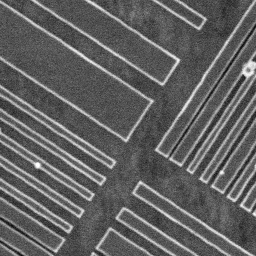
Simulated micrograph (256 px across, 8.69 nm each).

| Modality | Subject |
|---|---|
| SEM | groups of lines, slits or small figures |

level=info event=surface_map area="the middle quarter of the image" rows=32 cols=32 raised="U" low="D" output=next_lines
UUUUUUUUUDDDDDDDDUUUUUUUUUUUDDDD
UUUUUUUUUUDDDDDDDDDUUUUUUUUDDDDD
UUUUUUUUUUUUDDDDDDDDUUUUUUUDDDDD
UUUUUUUUUUUUUDDDDDDDDDUUUUDDDDDD
UUUUUUUUUUUUUUUDDDDDDDDUUDDDDDDD
UUUUUUUUUUUUUUUUDDDDDDDDDDDDDDDD
UUUUUUUUUUUUUUUUUUDDDDDDDDDDDDDD
UUUUUUUUUUUUUUUUUUUDDDDDDDDDDDDD
UUUUUUUUUUUUUUUUUUUUUDDDDDDDDDDD
DUUUUUUUUUUUUUUUUUUUUUDDDDDDDDDU
DDUUUUUUUUUUUUUUUUUUUDDDDDDDDDUU
DDDDUUUUUUUUUUUUUUUUUDDDDDDDDDUU
DDDDDUUUUUUUUUUUUUUUDDDDDDDDDUUU
DDDDDDDUUUUUUUUUUUUDDDDDDDDDUUUU
DDDDDDDDUUUUUUUUUUUDDDDDDDDDUUUU
DDDDDDDDDDUUUUUUUUDDDDDDDDDUUUUD
UDDDDDDDDDDUUUUUUDDDDDDDDDUUUUDU
UUDDDDDDDDDDDUUUUDDDDDDDDUUUUUDU
UUUUDDDDDDDDDDUUDDDDDDDDDUUUUDUU
DDUUUDDDDDDDDDDDDDDDDDDDUUUUDUUU
DDDUUUUDDDDDDDDDDDDDDDDDUUUUUUUU
DDDDDUUUDDDDDDDDDDDDDDDUUUUDUUUU
UDDDDDUUUUDDDDDDDDDDDDDDUUDUUUUD
UUDDDDDDUUUDDDDDDDDDDDDDDDDUUUUD
DUUUDDDDDUUUDDDDDDDDDDDDDDDDUUDD
DDUUUDDDDDDUDDDDDDDDDDDDDDDDDDDU
DDDDUUUDDDDDDDDDDDDDDDDDDDDDDDDU
DDDDDUUUUDDDDDDDDDDDDDDDDDDDDDDD
UDDDDDDUUUDDDDDDDDDDDDDDDDDDDDDD
UUUDDDDDUUDDDDDDDDDDDDDDDDDDDDDD
DUUUDDDDDDDDDDDDDDUUUDDDDDDDDDDD
DDDUUUDDDDDDDDDDDDUUUUDDDDDDDDDD